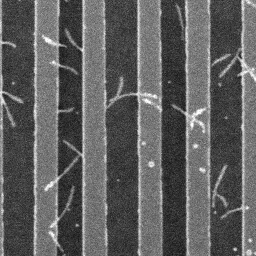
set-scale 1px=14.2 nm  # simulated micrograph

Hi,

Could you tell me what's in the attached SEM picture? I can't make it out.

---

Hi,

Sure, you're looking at lines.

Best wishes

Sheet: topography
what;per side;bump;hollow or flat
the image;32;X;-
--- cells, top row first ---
----XXX---XXX----XXX---XXX----XX
----XXX---XXX----XXX---XXX----XX
----XXX---XXX----XXX---XXX----XX
----XXX---XXX----XXX---XXX----XX
----XXX---XXX----XXX---XXX----XX
----XXX---XXX----XXX---XXX----XX
----XXX---XXX----XXX---XXX----XX
----XXX---XXX----XXX---XXX----XX
----XXX---XXX----XXX---XXX----XX
----XXX---XXX----XXX---XXX----XX
----XXX---XXX----XXX---XXX----XX
----XXX---XXX----XXX---XXX----XX
----XXX---XXX----XXX---XXX----XX
----XXX---XXX----XXX---XXX----XX
----XXX---XXX----XXX---XXX----XX
----XXX---XXX----XXX---XXX----XX
----XXX---XXX----XXX---XXX----XX
----XXX---XXX----XXX---XXX----XX
----XXX---XXX----XXX---XXX----XX
----XXX---XXX----XXX---XXX----XX
----XXX---XXX----XXX---XXX----XX
----XXX---XXX----XXX---XXX----XX
----XXX---XXX----XXX---XXX----XX
----XXX---XXX----XXX---XXX----XX
----XXX---XXX----XXX---XXX----XX
----XXX---XXX----XXX---XXX----XX
----XXX---XXX----XXX---XXX----XX
----XXX---XXX----XXX---XXX----XX
----XXX---XXX----XXX---XXX----XX
----XXX---XXX----XXX---XXX----XX
----XXX---XXX----XXX---XXX----XX
----XXX---XXX----XXX---XXX----XX